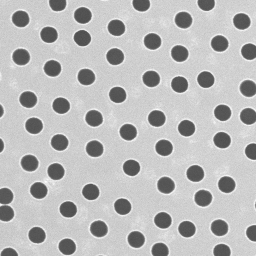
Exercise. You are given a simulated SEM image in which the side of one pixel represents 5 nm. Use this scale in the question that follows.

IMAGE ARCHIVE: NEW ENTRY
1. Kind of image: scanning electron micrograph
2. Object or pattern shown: a regular array of holes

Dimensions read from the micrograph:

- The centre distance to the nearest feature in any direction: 29.8 px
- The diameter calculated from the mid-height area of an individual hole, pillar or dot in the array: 83.6 nanometers